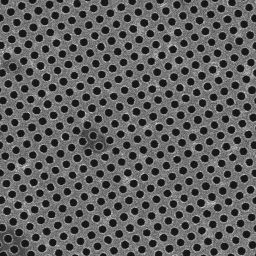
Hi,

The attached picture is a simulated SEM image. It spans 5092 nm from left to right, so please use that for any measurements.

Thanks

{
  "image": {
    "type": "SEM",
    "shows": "a regular array of holes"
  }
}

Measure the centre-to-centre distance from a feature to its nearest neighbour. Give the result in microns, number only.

0.242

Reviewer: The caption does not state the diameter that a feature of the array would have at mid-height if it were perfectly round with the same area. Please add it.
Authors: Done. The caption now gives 154 nm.